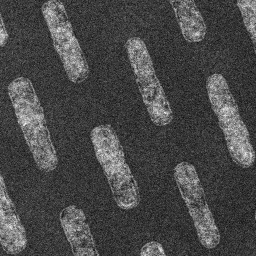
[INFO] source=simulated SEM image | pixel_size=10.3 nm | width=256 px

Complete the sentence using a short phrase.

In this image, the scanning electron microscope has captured holes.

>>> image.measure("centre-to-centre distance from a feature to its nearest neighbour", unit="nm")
908